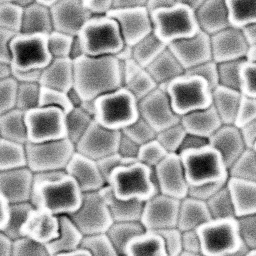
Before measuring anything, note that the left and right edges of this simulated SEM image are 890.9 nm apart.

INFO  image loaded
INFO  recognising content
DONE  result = a regular array of raised bodies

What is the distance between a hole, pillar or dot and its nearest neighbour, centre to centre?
251 nm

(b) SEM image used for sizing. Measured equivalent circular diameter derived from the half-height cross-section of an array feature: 0.134 microns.